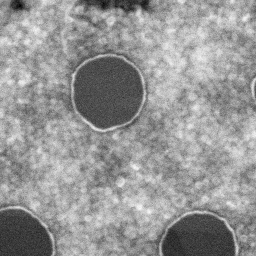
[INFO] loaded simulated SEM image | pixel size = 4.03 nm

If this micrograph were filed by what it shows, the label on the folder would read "raised bodies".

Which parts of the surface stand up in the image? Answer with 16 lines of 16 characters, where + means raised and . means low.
................
................
................
......+.........
.....++++.......
.....++++.......
.....++++.......
.....+++........
................
................
................
................
................
++.........+++..
+++.......+++++.
+++.......+++++.